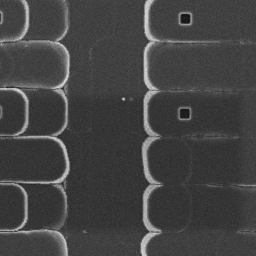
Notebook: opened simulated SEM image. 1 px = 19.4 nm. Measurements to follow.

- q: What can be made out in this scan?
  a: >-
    wiring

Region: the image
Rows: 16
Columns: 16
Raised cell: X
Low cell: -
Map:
XX-------XXXXXXX
XX-------XXXXXXX
XX-------XXXXXXX
XXXX-----XXXXXXX
XXXX-----XXXXXXX
XX-------XXXXXXX
XX-------XXXXXXX
XX-------XXXXXXX
XX-------XXXXXXX
XXXX-----XXXXXXX
XXXX-----XXXXXXX
XX-------XXXXXXX
XX-------XXXXXXX
XX-------XXXXXXX
XXX------XXXXXXX
XXXX-----XXXXXXX